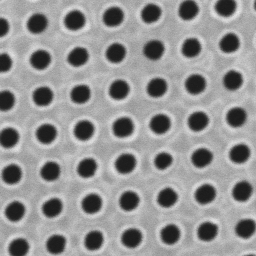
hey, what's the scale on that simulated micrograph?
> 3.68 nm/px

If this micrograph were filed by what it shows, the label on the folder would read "a regular array of holes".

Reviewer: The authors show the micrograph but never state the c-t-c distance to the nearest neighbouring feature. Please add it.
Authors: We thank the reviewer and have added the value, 135 nanometers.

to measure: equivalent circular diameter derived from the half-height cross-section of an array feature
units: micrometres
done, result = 0.0717